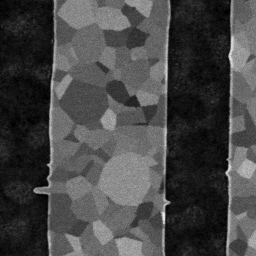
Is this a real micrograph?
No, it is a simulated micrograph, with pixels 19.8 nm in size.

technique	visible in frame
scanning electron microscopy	one or a few lines or trenches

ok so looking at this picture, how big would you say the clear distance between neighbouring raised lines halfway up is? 1260 nanometers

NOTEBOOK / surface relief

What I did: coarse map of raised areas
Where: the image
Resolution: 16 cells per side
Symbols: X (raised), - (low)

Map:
---XXXXXXXX---XX
---XXXXXXXX---XX
---XXXXXXX----XX
---XXXXXXX----XX
---XXXXXXX----XX
---XXXXXXX----XX
---XXXXXXX----XX
---XXXXXXX----XX
---XXXXXXX----XX
---XXXXXXX----XX
---XXXXXXX----XX
---XXXXXXX----XX
---XXXXXXX----XX
---XXXXXXX----XX
---XXXXXXX----XX
---XXXXXXX----XX